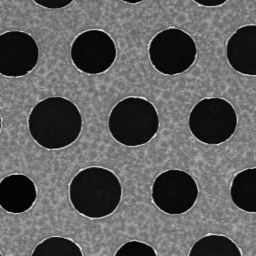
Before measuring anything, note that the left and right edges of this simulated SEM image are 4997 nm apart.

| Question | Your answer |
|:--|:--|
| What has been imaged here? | holes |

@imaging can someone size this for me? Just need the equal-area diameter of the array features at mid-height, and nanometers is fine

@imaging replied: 918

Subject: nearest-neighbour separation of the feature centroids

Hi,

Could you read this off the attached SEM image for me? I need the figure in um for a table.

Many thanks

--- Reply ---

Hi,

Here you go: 1.54